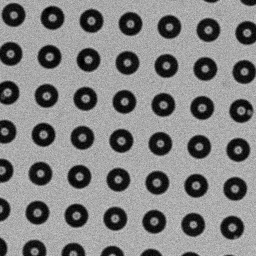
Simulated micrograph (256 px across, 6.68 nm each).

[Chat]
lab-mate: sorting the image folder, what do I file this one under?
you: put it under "an array of small figures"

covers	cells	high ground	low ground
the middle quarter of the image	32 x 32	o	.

ooo......oooo......ooo...o...ooo
oooo....ooooo......oooo......ooo
ooooooooooooooo..oooooo.....oooo
ooooooooooooooooooooooooo.oooooo
oooooooooooooooooooooooooooooooo
oooooooooooooooooooooooooooooooo
ooo....ooooooo..oooooooooooooooo
oo......ooooo....oooooo...oooooo
oo..oo..oooo......oooo.....ooooo
oo......oooo..oo..oooo......oooo
ooo.....oooo......oooo..oo..oooo
oooo...oooooo....ooooo......ooo.
ooooooooooooooo.ooooooo....ooooo
oooooooooooooooooooooooooooooooo
oooooooooooooooooooooooooooooooo
oooo..oooooooooooooooooooooooooo
oo.....oooooo...oooooooooooooooo
oo......oooo.....ooooo....oooooo
o...o...ooo...o..oooo......ooooo
oo......ooo..oo...ooo..oo..oooo.
oo.....oooo......oooo...o..oooo.
oooo..oooooo....ooooo......oooo.
oooooooooooooooooooooo....ooooo.
oooooooooooooooooooooooooooooooo
oooooooooooooooooooooooooooooooo
oo...ooooooooooooooooooooooooooo
o.....oooooo...oooooooo.oooooooo
o..o...oooo.....ooooo....ooooooo
o..oo..ooo...o...ooo......ooooo.
o......ooo...o...ooo..oo...ooo..
oo....ooooo.....oooo...o..oooo..
oooooooooooo...oooooo.....oooo..